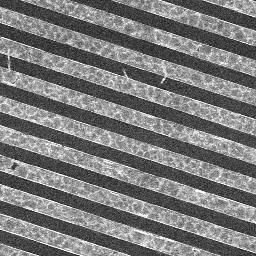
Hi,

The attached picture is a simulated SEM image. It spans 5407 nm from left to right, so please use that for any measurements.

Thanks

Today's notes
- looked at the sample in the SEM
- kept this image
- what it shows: parallel lines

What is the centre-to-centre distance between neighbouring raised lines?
593 nm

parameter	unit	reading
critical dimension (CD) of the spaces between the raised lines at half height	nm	284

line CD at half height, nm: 309